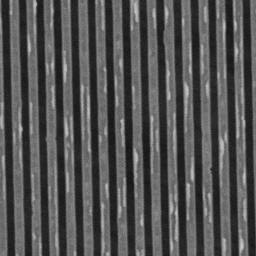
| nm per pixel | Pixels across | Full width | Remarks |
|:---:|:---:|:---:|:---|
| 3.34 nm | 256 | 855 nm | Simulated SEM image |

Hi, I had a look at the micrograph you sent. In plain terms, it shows parallel lines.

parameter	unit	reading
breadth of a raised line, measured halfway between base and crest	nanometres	30.5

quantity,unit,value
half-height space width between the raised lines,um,0.0276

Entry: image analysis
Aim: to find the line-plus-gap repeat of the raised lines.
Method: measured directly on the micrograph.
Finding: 57.5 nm